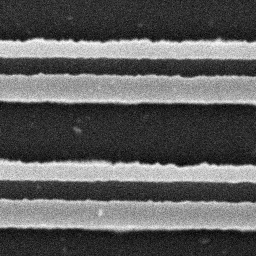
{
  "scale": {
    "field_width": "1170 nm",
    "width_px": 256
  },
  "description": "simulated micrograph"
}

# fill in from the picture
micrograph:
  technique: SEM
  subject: lines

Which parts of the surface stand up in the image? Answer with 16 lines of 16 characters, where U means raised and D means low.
DDDDDDDDDDDDDDDD
DDDDDDDDDDDDDDDD
DDDDDDDDDDDDDDDD
UUUUUUUUUUUUUUUU
UUUUUUUUUUUUUUUU
UUUUUUUUUUUUUUUU
DDDDDDDDDDDDDDDD
DDDDDDDDDDDDDDDD
DDDDDDDDDDDDDDDD
DDDDDDDDDDDDDDDD
UUUUUUUUUUUUUUUU
UUUUUUUUUUUUUUUU
UUUUUUUUUUUUUUUU
UUUUUUUUUUUUUUUU
DDDDDDDDDDDDDDDD
DDDDDDDDDDDDDDDD